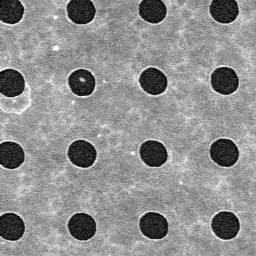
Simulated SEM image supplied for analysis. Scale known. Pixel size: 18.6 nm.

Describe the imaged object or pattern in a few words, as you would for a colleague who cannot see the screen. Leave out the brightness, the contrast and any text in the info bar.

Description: a regular array of holes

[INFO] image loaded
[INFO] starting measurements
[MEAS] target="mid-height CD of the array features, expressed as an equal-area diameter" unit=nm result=538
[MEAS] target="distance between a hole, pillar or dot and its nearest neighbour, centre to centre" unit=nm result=1330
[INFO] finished